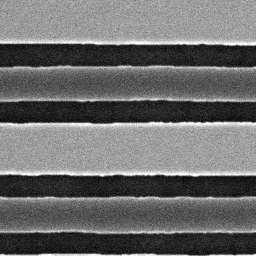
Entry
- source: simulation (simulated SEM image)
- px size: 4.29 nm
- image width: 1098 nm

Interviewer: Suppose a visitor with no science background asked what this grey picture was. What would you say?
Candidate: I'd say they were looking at lines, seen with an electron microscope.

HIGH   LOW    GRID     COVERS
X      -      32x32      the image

XXXXXXXXXXXXXXXXXXXXXXXXXXXXXXXX
XXXXXXXXXXXXXXXXXXXXXXXXXXXXXXXX
XXXXXXXXXXXXXXXXXXXXXXXXXXXXXXXX
XXXXXXXXXXXXXXXXXXXXXXXXXXXXXXXX
XXXXXXXXXXXXXXXXXXXXXXXXXXXXXXXX
----------------------------XXXX
--------------------------------
--------------------------------
-XXX-XXXXXXXXXXXXXXXXXXXXXXX---X
XXXXXXXXXXXXXXXXXXXXXXXXXXXXXXXX
XXXXXXXXXXXXXXXXXXXXXXXXXXXXXXXX
XXXXXXXXXXXXXXXXXXXXXXXXXXXXXXXX
XXXXXXXXXXXXXXXXXX-X-XXXXXXXXXXX
--------------------------------
--------------------------------
XX-XXXXXXXXX--XXXXXXXXXXXXXXXXXX
XXXXXXXXXXXXXXXXXXXXXXXXXXXXXXXX
XXXXXXXXXXXXXXXXXXXXXXXXXXXXXXXX
XXXXXXXXXXXXXXXXXXXXXXXXXXXXXXXX
XXXXXXXXXXXXXXXXXXXXXXXXXXXXXXXX
XXXXXXXXXXXXXXXXXXXXXXXXXXXXXXXX
XXXXXXXXXXXXXXXXXXXXXXXXXXXXXXXX
--------------------------------
--------------------------------
--------------------------------
XXXXXXXXXXXXXXXXXXXXXXXXXXXXXXXX
XXXXXXXXXXXXXXXXXXXXXXXXXXXXXXXX
XXXXXXXXXXXXXXXXXXXXXXXXXXXXXXXX
XXXXXXXXXXXXXXXXXXXXXXXXXXXXXXXX
--------------------------------
--------------------------------
--------------------------------